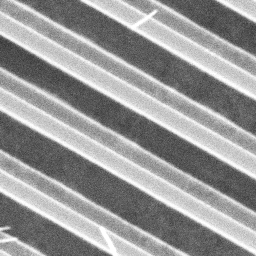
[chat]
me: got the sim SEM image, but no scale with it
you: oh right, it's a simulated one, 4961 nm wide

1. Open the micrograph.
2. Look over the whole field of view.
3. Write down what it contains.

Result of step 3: lines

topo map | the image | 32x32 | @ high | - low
@@---------@@@@@@@@@--------@@@@
@@@@---------@@@@@@@@---------@@
@@@@@@---------@@@@@@@@---------
@@@@@@@@--------@@@@@@@@@-------
-@@@@@@@@---------@@@@@@@@@-----
--@@@@@@@@@---------@@@@@@@@@---
----@@@@@@@@@---------@@@@@@@@--
------@@@@@@@@@--------@@@@@@@@@
--------@@@@@@@@@--------@@@@@@@
@--------@@@@@@@@@---------@@@@@
@@@--------@@@@@@@@@---------@@@
@@@@@--------@@@@@@@@@--------@@
@@@@@@@--------@@@@@@@@@--------
@@@@@@@@@-------@@@@@@@@@-------
--@@@@@@@@--------@@@@@@@@@-----
---@@@@@@@@@--------@@@@@@@@@---
-----@@@@@@@@@--------@@@@@@@@@-
-------@@@@@@@@@--------@@@@@@@@
---------@@@@@@@@--------@@@@@@@
@---------@@@@@@@@@--------@@@@@
@@@---------@@@@@@@@@--------@@@
@@@@@---------@@@@@@@@@--------@
@@@@@@----------@@@@@@@@--------
@@@@@@@@----------@@@@@@@@------
-@@@@@@@@@---------@@@@@@@@@----
---@@@@@@@@@---------@@@@@@@@@--
-----@@@@@@@@----------@@@@@@@@-
-------@@@@@@@@----------@@@@@@@
--------@@@@@@@@@---------@@@@@@
@---------@@@@@@@@@---------@@@@
@@@---------@@@@@@@@----------@@
@@@@----------@@@@@@@@----------